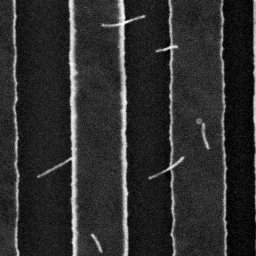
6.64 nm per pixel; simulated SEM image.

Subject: lines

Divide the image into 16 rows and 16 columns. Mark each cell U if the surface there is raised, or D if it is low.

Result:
UDDDUUUUDDDUUUDD
UDDDUUUUDDDUUUDD
UDDDUUUUDDDUUUDD
UDDDUUUUDDDUUUDD
UDDDUUUUDDDUUUDD
UDDDUUUUDDDUUUDD
UDDDUUUUDDDUUUDD
UDDDDUUUDDDUUUDD
UDDDDUUUDDDUUUDD
UDDDDUUUDDDUUUDD
UDDDDUUUDDDUUUDD
UDDDDUUUDDDUUUDD
UDDDDUUUDDDUUUDD
UDDDDUUUDDDUUUDD
UDDDDUUUDDDUUUDD
UDDDDUUUDDDUUUDD